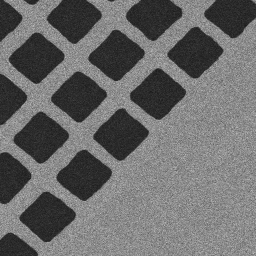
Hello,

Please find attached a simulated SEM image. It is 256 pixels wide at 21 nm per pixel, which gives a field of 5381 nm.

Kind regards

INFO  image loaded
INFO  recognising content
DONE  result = a regular array of holes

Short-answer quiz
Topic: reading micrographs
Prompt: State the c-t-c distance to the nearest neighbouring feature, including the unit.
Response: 1170 nanometers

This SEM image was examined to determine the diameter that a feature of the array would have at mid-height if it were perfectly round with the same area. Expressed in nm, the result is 973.